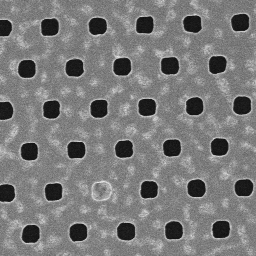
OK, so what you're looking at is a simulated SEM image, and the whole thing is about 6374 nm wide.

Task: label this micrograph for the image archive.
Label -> a regular array of holes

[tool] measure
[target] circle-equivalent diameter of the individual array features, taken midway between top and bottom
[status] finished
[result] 467 nanometres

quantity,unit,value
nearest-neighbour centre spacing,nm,1180